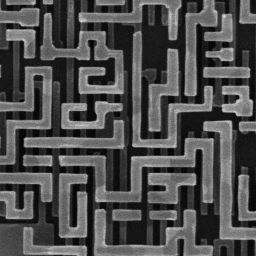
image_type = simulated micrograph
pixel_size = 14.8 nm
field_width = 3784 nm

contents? wiring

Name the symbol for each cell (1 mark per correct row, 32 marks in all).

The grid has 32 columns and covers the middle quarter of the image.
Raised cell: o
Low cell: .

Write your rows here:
.............oo..oo.......oo..oo
....oooooo...oo..oo.......oo..oo
....oooooo...oo..oo.......oo..oo
....oo.......oo..oo.......oo..oo
....oo.......oo..oo.......oo..oo
....ooooooooooo..oo..ooooooo..oo
....ooooooooooo..oo..ooooooo..oo
.................oo..ooooooo..oo
.................oo..ooo........
.................oo..ooo........
oooooo..oooooo...oo..ooo..oooooo
ooooo...oooooo...oo..ooo..oooooo
o.......oo.......oo..ooo..oo....
o.......oo.......oo..ooo..oo....
ooooo..ooo...oo..oo..ooo..oo....
oooooooooo...oo..oo..ooo..oo....
.............oo..oo..ooo..oo....
.............oo..oo.......oo....
ooooooo.....ooo..oo.......oo....
ooooooooooooooo..ooooooooooo..oo
ooooooooooooooo..ooooooooooo..oo
..............................oo
..............................oo
oooooooooo.......ooooooooooooooo
oooooooooo.......ooooooooooooooo
.......ooo.......ooo.ooooooooooo
........oo.......oo.............
oo......oo.......oo..ooooooooooo
oooooo..oo.......oo..ooooooooooo
oooooo..oo.......oo..ooooooooooo
o.......oo.......oo......oooo...
o.......oo.......oo......ooo....